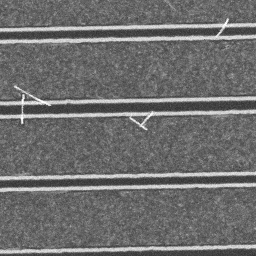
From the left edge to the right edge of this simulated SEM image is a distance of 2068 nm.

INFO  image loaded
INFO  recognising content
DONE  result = one or a few lines or trenches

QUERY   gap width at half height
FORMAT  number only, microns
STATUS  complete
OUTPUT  0.494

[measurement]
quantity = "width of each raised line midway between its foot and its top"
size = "103 nm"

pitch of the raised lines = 0.599 µm